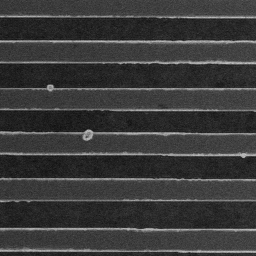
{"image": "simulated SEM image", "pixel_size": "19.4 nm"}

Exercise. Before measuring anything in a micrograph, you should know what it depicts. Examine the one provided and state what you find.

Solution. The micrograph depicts lines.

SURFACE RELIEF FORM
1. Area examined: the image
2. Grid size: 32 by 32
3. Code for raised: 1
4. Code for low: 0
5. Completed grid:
11111111111111111111111111111111
11111111111111111111111111111111
00000000000000000000000000000000
00000000000000000000000000000000
00000000000000000000000000000000
11111111111111111111111111111111
11111111111111111111111111111111
11111111111111111111111111111111
00000000000000000000000000000000
00000000000000000000000000000000
00000000000000000000000000000000
11111111111111111111111111111111
11111111111111111111111111111111
11111111111111111111111111111111
00000000000000000000000000000000
00000000000000000000000000000000
00000000001100000000000000000000
11111111111111111111111111111111
11111111111111111111111111111111
00000000000000000000000000000010
00000000000000000000000000000000
00000000000000000000000000000000
11111111111111111111111111111111
11111111111111111111111111111111
11111111111111111111111111111111
00000000000000000000000000000000
00000000000000000000000000000000
00000000000000000000000000000000
00000000000000000000000000000000
11111111111111111111111111111111
11111111111111111111111111111111
00000000000000000000001111111111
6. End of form